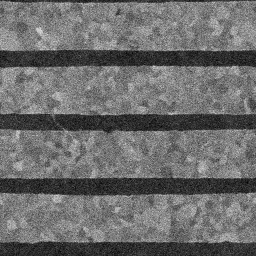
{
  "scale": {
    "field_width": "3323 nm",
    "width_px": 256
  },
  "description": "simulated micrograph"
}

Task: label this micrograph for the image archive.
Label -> one or a few lines or trenches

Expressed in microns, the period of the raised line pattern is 0.831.